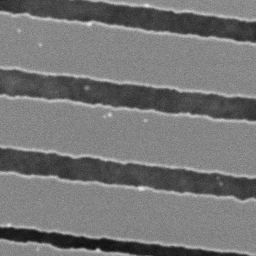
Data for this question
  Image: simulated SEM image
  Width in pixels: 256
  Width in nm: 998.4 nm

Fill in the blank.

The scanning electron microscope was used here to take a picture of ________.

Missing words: lines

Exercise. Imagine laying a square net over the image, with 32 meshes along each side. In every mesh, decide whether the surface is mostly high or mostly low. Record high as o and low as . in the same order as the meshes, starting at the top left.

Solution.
..............oooooooooooooooooo
o.....................o.oooooooo
oooooooo......................oo
ooooooooooooooooo...............
ooooooooooooooooooooooooo.......
oooooooooooooooooooooooooooooooo
oooooooooooooooooooooooooooooooo
oooooooooooooooooooooooooooooooo
oooooooooooooooooooooooooooooooo
.........ooooooooooooooooooooooo
...............ooooooooooooooooo
.........................ooooooo
oooooo..........................
oooooooooooooooo................
ooooooooooooooooooooooooo.......
oooooooooooooooooooooooooooooooo
oooooooooooooooooooooooooooooooo
oooooooooooooooooooooooooooooooo
..oooooooooooooooooooooooooooooo
........oooooooooooooooooooooooo
..................oooooooooooooo
.........................ooooooo
ooooooooo.......................
ooooooooooooooooooo.............
ooooooooooooooooooooooooooo.....
oooooooooooooooooooooooooooooooo
oooooooooooooooooooooooooooooooo
oooooooooooooooooooooooooooooooo
...ooooooooooooooooooooooooooooo
..........oooooooooooooooooooooo
oooooo..............oooooooooooo
ooooooooooooo................ooo